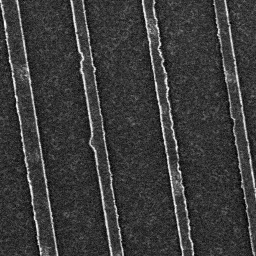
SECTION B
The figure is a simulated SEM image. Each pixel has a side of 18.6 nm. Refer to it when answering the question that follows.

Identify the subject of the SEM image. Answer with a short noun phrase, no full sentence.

one or a few lines or trenches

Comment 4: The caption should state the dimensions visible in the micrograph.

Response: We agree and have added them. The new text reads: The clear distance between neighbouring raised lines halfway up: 58.6 px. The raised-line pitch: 69.1 px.